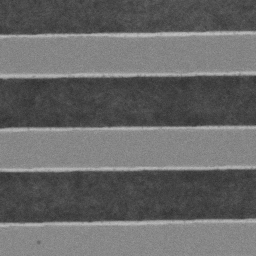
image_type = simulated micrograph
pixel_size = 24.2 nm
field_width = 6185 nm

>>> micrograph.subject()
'lines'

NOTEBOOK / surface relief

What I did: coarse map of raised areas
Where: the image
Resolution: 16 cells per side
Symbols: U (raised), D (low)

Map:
DDDDDDDDDDDDDDDD
DDDDDDDDDDDDDDDD
UUUUUUUUUUUUUUUU
UUUUUUUUUUUUUUUU
UUUUUUUUUUUUUUUU
DDDDDDDDDDDDDDDD
DDDDDDDDDDDDDDDD
DDDDDDDDDDDDDDDD
UUUUUUUUUUUUUUUU
UUUUUUUUUUUUUUUU
UUUUUUUUUUUUUUUD
DDDDDDDDDDDDDDDD
DDDDDDDDDDDDDDDD
DDDDDDDDDDDDDDDD
UUUUUUUUUUUUUUUU
UUUUUUUUUUUUUUUU